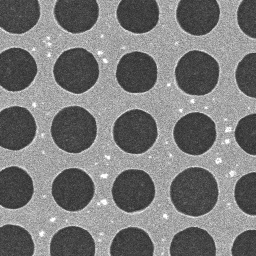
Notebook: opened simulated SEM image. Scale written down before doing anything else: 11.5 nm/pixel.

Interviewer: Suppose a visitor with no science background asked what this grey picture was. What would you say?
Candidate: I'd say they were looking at a regular array of holes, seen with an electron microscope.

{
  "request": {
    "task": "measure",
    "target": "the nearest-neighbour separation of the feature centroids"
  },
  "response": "681 nm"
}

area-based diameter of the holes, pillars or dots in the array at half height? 511 nm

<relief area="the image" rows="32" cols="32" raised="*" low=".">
.....**.....***.....**.....***..
.....**.....***.....**.....***..
.....**.....***.....**.....***..
....****...****....****....***..
*******************************.
********************************
....****...*****.*******.*******
....***.....***....***.....***..
.....**.....***.....**.....***..
....***.....***.....**.....**...
....***.....***....***.....***..
*********..*****..*****...****..
********************************
*..*****..**********************
....***.....***....****...*****.
.....*......**......**.....***..
....**......**......**.....**...
....***.....**.....***.....**...
*..****....****....***....****..
********************************
********************************
...*****...****...*****...******
....***.....**.....***.....***..
....**......**.....**......**...
....***.....**.....**......**...
...****....****....***.....***..
***********************...****..
********************************
...*****..******.******..*******
....***....***.....***....****..
....**......**.....**......**...
....**......**.....**......**...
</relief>